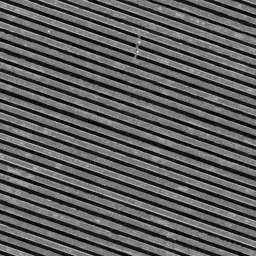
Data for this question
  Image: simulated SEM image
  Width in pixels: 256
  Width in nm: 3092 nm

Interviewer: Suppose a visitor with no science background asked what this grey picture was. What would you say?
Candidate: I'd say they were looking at parallel lines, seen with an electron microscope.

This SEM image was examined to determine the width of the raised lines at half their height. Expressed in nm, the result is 65.7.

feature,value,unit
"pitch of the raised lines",0.116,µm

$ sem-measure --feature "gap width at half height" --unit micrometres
0.0442